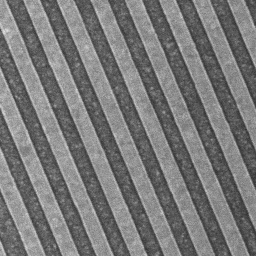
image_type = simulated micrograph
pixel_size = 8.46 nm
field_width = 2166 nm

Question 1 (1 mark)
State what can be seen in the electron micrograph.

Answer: parallel lines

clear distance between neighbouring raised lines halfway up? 0.142 µm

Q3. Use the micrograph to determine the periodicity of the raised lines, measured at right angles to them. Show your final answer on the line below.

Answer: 0.265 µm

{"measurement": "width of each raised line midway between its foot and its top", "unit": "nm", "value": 127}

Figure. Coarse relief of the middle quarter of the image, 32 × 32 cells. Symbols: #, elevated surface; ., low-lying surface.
#....####.....####....####.....#
#.....####....####.....####....#
##....####.....####....####.....
##....#####....####.....####....
##.....####....####.....####....
###....####.....####....####....
###.....####....####.....####...
####....####.....####....####...
####.....####....####.....####..
.###.....####....####.....####..
.####.....###.....####....####..
.####.....####....#####....####.
..####....####.....####....####.
..####.....####....####.....####
...####....####.....####....####
...####.....####....####.....###
....####....####....####.....###
....####....####.....####....###
.....###.....####....####.....##
.....####....####.....####....##
#....####.....####....####.....#
#.....####....####....####.....#
#.....####....#####....####.....
##.....###.....####....####.....
##.....####....####.....####....
###....####.....####....####....
###.....####....####.....####...
####....####.....####....####...
####.....####....####....#####..
.####....####....####.....####..
.####.....####....####....####..
.####.....####....####.....####.